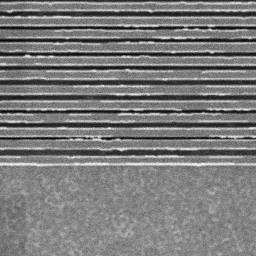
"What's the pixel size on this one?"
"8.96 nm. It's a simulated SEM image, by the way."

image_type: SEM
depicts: parallel lines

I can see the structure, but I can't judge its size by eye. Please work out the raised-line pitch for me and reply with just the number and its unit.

125 nanometers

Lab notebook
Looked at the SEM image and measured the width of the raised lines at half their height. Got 84 nanometers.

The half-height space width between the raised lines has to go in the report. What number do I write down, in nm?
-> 42.6